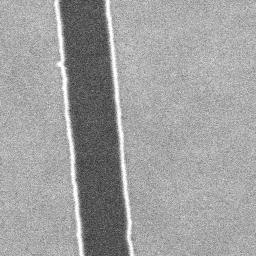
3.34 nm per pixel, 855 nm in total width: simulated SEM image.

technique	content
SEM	one or a few lines or trenches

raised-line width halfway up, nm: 174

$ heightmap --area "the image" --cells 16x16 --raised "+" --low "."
....+++.........
....+++.........
....+++.........
....+++.........
....+++.........
....+++.........
....+++.........
....+++.........
....++++........
....++++........
.....+++........
.....+++........
.....+++........
.....+++........
.....+++........
.....+++........